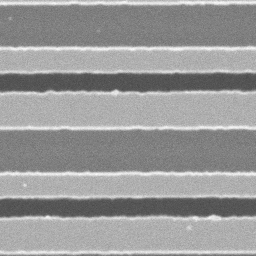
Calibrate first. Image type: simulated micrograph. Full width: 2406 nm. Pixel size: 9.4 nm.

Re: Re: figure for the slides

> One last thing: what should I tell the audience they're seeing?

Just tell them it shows lines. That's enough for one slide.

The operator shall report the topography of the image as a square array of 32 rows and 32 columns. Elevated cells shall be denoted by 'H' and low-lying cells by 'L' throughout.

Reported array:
LLLLLLLLLLLLLLLLLLLLLLLLLLLLLLLL
LLLLLLLLLLLLLLLLLLLLLLLLLLLLLLLL
LLLLLLLLLLLLLLLLLLLLLLLLLLLLLLLL
LLLLLLLLLLLLLLLLLLLLLLLLLLLLLLLL
LLLLLLLLLLLLLLLLLLLLLLLLLLLLLLLL
LLLLLLLLLLLLLLLLLLLLLLLLLLLLLLLL
HHHHHHHHHHHHHHHHHHHHHHHHHHHHHHHH
HHHHHHHHHHHHHHHHHHHHHHHHHHHHHHHH
HHHHHHHHHHHHHHHHHHHHHHHHHHHHHHHH
LLLLLLLLLLLLLLLLLLLLLLLLLLLLLLLL
LLLLLLLLLLLLLLLLLLLLLLLLLLLLLLLL
LLLLLLHLHHHHLLHLLLLLLHHHHHHHHHHH
HHHHHHHHHHHHHHHHHHHHHHHHHHHHHHHH
HHHHHHHHHHHHHHHHHHHHHHHHHHHHHHHH
HHHHHHHHHHHHHHHHHHHHHHHHHHHHHHHH
HHHHHHHHHHHHHHHHHHHHHHHHHHHHHHHH
LLLLLLLLLLLLLLLLLLLLLLLLLLLLLLLL
LLLLLLLLLLLLLLLLLLLLLLLLLLLLLLLL
LLLLLLLLLLLLLLLLLLLLLLLLLLLLLLLL
LLLLLLLLLLLLLLLLLLLLLLLLLLLLLLLL
LLLLLLLLLLLLLLLLLLLLLLLLLLLLLLLL
LLLLLLLLLLLLLLLLLLLLLLLLLLLLLLLL
HHHHHHHHHHHHHHHHHHHHHHHHHHHHHHHH
HHHHHHHHHHHHHHHHHHHHHHHHHHHHHHHH
HHHHHHHHHHHHHHHHHHHHHHHHHHHHHHHH
LLLLLLLLLLLLLLLLLLLLLLLLLLLLLLLL
LLLLLLLLLLLLLLLLLLLLLLLLLLLLLLLL
HHHHHHHHHHHHHHHHHHHHHHHHHHHHHHHH
HHHHHHHHHHHHHHHHHHHHHHHHHHHHHHHH
HHHHHHHHHHHHHHHHHHHHHHHHHHHHHHHH
HHHHHHHHHHHHHHHHHHHHHHHHHHHHHHHH
HHHHHHHHHHHHHHHHHHHHHHHHHHHHHHHH